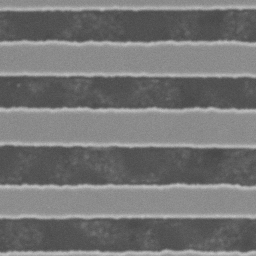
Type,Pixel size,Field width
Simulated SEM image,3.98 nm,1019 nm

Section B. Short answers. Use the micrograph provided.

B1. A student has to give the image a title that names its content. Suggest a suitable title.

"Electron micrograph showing lines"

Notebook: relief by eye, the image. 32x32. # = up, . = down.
################################
................................
................................
................................
................................
################################
################################
################################
################################
.......##.##.##.################
................................
................................
................................
..#.....###.............#.#.....
################################
################################
################################
################################
...............................#
................................
................................
................................
................................
################################
################################
################################
################################
................................
................................
................................
................................
.###.########...##############.#